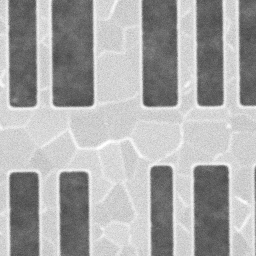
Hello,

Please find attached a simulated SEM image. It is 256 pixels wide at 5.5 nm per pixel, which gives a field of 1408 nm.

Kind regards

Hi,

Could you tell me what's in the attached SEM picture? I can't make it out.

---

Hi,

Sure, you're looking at groups of lines, slits or small figures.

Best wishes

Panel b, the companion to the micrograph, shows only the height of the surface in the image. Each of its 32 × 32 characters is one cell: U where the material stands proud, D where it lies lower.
UDDDDUDDDDDDUUUUUUDDDDUUDDDDUUDD
UDDDDUDDDDDDUUUUUUDDDDUUDDDDUUDD
UDDDDUDDDDDDUUUUUUDDDDUUDDDDUUDD
UDDDDUDDDDDDUUUUUUDDDDUUDDDDUUDD
UDDDDUDDDDDDUUUUUUDDDDUUDDDDUUDD
UDDDDUDDDDDDUUUUUUDDDDUUDDDDUUDD
UDDDDUDDDDDDUUUUUUDDDDUUDDDDUUDD
UDDDDUDDDDDDUUUUUUDDDDUUDDDDUUDD
UDDDDUDDDDDDUUUUUUDDDDUUDDDDUUDD
UDDDDUDDDDDDUUUUUUDDDDUUDDDDUUDD
UDDDDUDDDDDDUUUUUUDDDDUUDDDDUUDD
UDDDDUDDDDDDUUUUUUDDDDUUDDDDUUDD
UDDDDUDDDDDDUUUUUUDDDDUUDDDDUUDD
UUDDUUUDDDDUUUUUUUUDDUUUUUUUUUUU
UUUUUUUUUUUUUUUUUUUUUUUUUUUUUUUU
UUUUUUUUUUUUUUUUUUUUUUUUUUUUUUUU
UUUUUUUUUUUUUUUUUUUUUUUUUUUUUUUU
UUUUUUUUUUUUUUUUUUUUUUUUUUUUUUUU
UUUUUUUUUUUUUUUUUUUUUUUUUUUUUUUU
UUUUUUUUUUUUUUUUUUUUUUUUUUUUUUUU
UUUUUUUUUUUUUUUUUUUUDUUUUDDDUUUU
UDDDDUUUDDDUUUUUUUUDDDUUDDDDDUUU
UDDDDUUDDDDUUUUUUUUDDDUUDDDDDUUU
UDDDDUUDDDDUUUUUUUUDDDUUDDDDDUUU
UDDDDUUDDDDUUUUUUUUDDDUUDDDDDUUU
UDDDDUUDDDDUUUUUUUUDDDUUDDDDDUUU
UDDDDUUDDDDUUUUUUUUDDDUUDDDDDUUU
UDDDDUUDDDDUUUUUUUUDDDUUDDDDDUUU
UDDDDUUDDDDUUUUUUUUDDDUUDDDDDUUU
UDDDDUUDDDDUUUUUUUUDDDUUDDDDDUUU
UDDDDUUDDDDUUUUUUUUDDDUUDDDDDUUU
UDDDDUUDDDDUUUUUUUUDDDUUDDDDDUUU